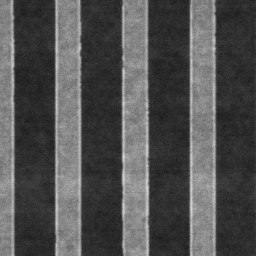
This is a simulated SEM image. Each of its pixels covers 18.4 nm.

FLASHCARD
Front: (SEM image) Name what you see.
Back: lines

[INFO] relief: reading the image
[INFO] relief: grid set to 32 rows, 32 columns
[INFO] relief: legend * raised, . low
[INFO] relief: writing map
*......***.....***......***.....
**.....***.....***......***.....
**.....***.....***......***.....
**.....***.....***......***.....
**.....***.....***......***.....
**.....***.....***......***.....
**.....***.....***......***.....
**.....***.....***......***.....
**.....***.....***......***.....
**.....***.....***......***.....
**.....***.....***......***.....
**.....***.....***......***.....
**.....***.....***......***.....
**.....***.....***......***.....
**.....***.....***......***.....
**.....***.....***......***.....
**.....***.....***......***.....
**.....***.....***......***.....
**.....***.....***......***.....
**.....***.....***......***.....
**.....***.....***......***.....
**.....***.....***......***.....
**.....***.....***......***.....
**.....***.....***......***.....
**.....***.....***......***.....
**.....***.....***......***.....
**.....***.....***......***.....
**.....***.....***......***.....
**.....***.....***......***.....
**.....***.....***......***.....
**.....***.....***......***.....
**.....***.....***......***.....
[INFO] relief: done